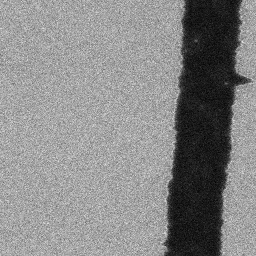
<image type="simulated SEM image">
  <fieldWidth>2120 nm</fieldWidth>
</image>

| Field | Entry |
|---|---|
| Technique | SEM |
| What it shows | one or a few lines or trenches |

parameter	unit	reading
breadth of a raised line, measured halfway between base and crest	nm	474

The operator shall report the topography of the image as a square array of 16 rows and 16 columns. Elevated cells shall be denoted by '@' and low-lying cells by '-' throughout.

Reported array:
-----------@@@@-
-----------@@@@-
-----------@@@@-
-----------@@@@-
-----------@@@@-
-----------@@@@-
-----------@@@@-
-----------@@@@-
-----------@@@@-
-----------@@@@-
-----------@@@--
----------@@@@--
----------@@@@--
----------@@@@--
----------@@@@--
----------@@@@--